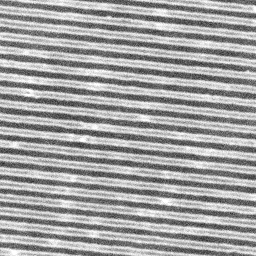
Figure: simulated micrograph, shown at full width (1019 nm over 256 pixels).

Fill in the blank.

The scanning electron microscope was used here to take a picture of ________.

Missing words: parallel lines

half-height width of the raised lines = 0.0267 microns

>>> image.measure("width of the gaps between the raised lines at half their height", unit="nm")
26.7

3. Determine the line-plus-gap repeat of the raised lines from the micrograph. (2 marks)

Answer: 0.0532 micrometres